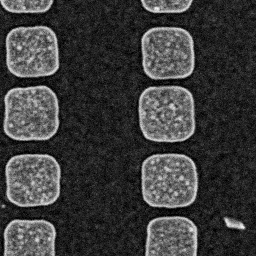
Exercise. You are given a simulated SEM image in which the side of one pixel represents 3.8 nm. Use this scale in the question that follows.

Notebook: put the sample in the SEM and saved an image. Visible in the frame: raised bodies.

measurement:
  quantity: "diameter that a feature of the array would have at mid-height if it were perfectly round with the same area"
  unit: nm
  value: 214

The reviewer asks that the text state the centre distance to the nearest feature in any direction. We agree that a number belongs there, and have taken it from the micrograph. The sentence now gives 0.234 microns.